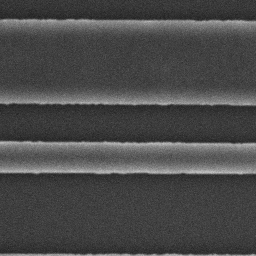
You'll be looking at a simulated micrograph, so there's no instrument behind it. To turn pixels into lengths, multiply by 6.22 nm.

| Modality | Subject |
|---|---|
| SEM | lines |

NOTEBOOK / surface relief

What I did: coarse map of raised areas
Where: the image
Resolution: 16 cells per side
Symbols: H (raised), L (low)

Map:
LLLLLLLLLLLLLLLL
HHHHHHHHHHHHHHHH
HHHHHHHHHHHHHHHH
HHHHHHHHHHHHHHHH
HHHHHHHHHHHHHHHH
HHHHHHHHHHHHHHHH
LLLLLLLLHLLLHHHH
LLLLLLLLLLLLLLLL
LLLLLLLLLLLLLLLL
HHHHHHHHHHHHHHHH
HHHHHHHHHHHHHHHH
LLLLLLLLLLLLLLLL
LLLLLLLLLLLLLLLL
LLLLLLLLLLLLLLLL
LLLLLLLLLLLLLLLL
LLLLLLLLLLLLLLLL